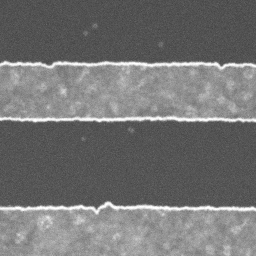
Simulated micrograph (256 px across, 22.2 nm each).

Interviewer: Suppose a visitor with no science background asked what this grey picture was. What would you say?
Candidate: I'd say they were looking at one or a few lines or trenches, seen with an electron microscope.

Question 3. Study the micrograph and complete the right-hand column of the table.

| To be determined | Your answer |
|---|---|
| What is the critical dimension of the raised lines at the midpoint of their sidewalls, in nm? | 1990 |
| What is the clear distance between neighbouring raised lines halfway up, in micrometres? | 1.21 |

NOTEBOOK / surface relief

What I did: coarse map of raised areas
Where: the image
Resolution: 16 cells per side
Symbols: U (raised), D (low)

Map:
UUUUUUUUUUUUUUUU
UUUUUUUUUUUUUUUU
UUUUUUUUUUUUUUUU
UUUUUUUUUUUUUUUU
DDDDDDDDDDDDDDDD
DDDDDDDDDDDDDDDD
DDDDDDDDDDDDDDDD
UUUUUUUUUUUUUUUD
UUUUUUUUUUUUUUUU
UUUUUUUUUUUUUUUU
UUUUUUUUUUUUUUUU
UUUUUUUUUUUUUUUU
UUUUUUUUUUUUUUUU
DDDDDDDDDDDDDDDD
DDDDDDDDDDDDDDDD
DDDDDDDDDDDDDDDD